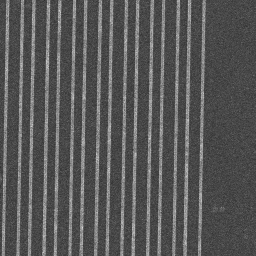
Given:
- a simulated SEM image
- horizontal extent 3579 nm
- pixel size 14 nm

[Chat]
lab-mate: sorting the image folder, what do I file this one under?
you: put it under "parallel lines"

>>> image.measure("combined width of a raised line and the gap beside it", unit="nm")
183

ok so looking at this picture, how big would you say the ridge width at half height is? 0.0385 micrometres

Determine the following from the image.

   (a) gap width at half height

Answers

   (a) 0.161 microns